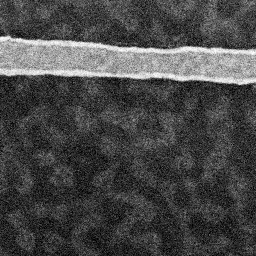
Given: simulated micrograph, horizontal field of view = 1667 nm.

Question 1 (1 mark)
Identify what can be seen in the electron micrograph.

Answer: one or a few lines or trenches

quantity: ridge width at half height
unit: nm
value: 189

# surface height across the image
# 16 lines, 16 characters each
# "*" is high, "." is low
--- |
................
................
*...............
****************
****************
................
................
................
................
................
................
................
................
................
................
................